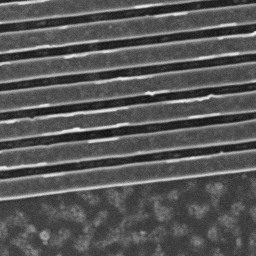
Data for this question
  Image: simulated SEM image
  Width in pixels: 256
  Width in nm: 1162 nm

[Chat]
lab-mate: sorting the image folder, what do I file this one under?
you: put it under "parallel lines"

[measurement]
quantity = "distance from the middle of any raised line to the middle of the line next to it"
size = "132 nm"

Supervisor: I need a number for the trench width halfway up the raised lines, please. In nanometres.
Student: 43.4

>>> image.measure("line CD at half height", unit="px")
19.3